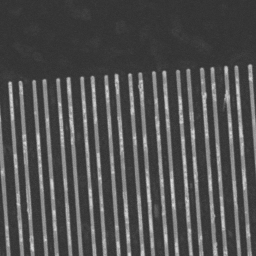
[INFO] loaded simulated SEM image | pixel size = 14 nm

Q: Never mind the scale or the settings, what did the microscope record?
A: parallel lines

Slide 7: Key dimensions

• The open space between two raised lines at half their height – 134 nanometres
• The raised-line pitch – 168 nanometres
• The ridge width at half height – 0.054 micrometres